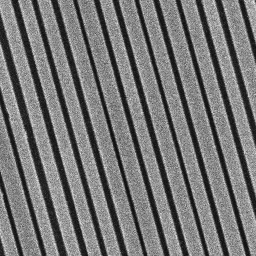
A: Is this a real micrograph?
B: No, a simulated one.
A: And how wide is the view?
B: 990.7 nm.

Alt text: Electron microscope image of parallel lines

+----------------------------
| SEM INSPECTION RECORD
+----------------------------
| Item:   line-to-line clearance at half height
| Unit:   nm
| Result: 21.9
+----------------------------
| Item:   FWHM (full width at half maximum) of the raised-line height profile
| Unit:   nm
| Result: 54.5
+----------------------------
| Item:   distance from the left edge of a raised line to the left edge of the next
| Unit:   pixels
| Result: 19.7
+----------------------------